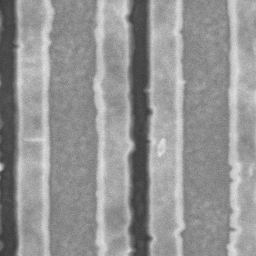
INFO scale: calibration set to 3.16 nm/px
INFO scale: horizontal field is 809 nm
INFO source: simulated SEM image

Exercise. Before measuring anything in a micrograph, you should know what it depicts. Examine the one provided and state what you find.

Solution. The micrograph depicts one or a few lines or trenches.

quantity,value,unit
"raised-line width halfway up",0.0977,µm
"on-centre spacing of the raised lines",210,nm